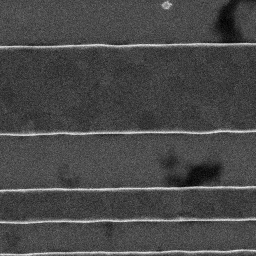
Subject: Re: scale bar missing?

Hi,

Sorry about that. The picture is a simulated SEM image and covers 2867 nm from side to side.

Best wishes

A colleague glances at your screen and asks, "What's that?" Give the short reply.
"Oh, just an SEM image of wiring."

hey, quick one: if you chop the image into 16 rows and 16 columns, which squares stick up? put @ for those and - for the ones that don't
----------------
----------------
----------------
@@@@@@@@@@@@@@@@
@@@@@@@@@@@@@@@@
@@@@@@@@@@@@@@@@
@@@@@@@@@@@@@@@@
@@@@@@@@@@@@@@@@
----------------
----------------
----------------
----------------
@@@@@@@@@@@@@@@@
@@@@@@@@@@@@@@@@
----------------
----------------